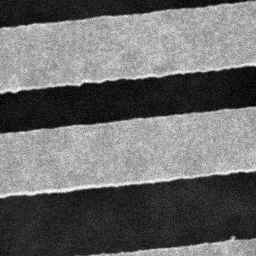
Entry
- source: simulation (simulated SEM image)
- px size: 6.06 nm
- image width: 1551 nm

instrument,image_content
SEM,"lines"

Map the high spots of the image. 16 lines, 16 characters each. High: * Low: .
.............***
...*************
****************
****************
************....
***.............
................
........********
****************
****************
****************
********........
................
................
................
...........*****